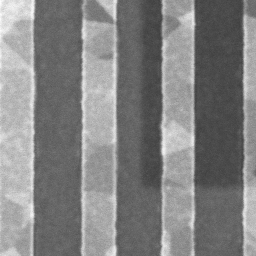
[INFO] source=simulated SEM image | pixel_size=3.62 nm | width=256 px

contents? lines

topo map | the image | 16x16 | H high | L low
HHLLLHHLLLHHLLLH
HHLLLHHLLLHHLLLH
HHLLLHHLLLHHLLLH
HHLLLHHLLLHHLLLH
HHLLLHHLLLHHLLLH
HHLLLHHLLLHHLLLH
HHLLLHHLLLHHLLLH
HHLLLHHLLLHHLLLH
HHLLLHHLLLHHLLLH
HHLLLHHLLLHHLLLH
HHLLLHHLLLHHLLLH
HHLLLHHLLLHHLLLH
HHLLLHHLLLHHLLLH
HHLLLHHLLLHHLLLH
HHLLLHHLLLHHLLLH
HHLLLHHLLLHHLLLH